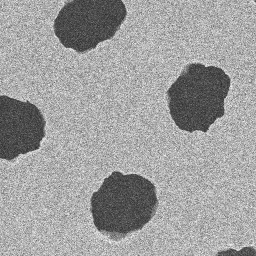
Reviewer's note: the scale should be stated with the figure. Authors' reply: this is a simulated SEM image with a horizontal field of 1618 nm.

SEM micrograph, holes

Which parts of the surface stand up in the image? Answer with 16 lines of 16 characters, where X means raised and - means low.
XXXX----XXXXXXXX
XXX-----XXXXXXXX
XXXX---XXXXXXXXX
XXXXXXXXXXXXXXXX
XXXXXXXXXXX---XX
XXXXXXXXXXX---XX
--XXXXXXXXX---XX
---XXXXXXXX---XX
---XXXXXXXXXXXXX
--XXXXXXXXXXXXXX
XXXXXXXXXXXXXXXX
XXXXXX---XXXXXXX
XXXXXX----XXXXXX
XXXXXX----XXXXXX
XXXXXX--XXXXXXXX
XXXXXXXXXXXXXXX-